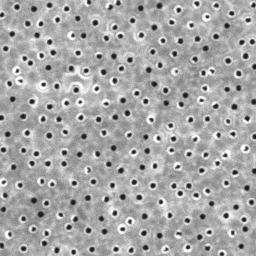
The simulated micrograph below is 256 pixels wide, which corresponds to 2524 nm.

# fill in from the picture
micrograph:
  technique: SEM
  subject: a regular array of holes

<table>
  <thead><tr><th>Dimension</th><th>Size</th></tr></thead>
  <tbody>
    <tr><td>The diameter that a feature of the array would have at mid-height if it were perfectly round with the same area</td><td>0.0567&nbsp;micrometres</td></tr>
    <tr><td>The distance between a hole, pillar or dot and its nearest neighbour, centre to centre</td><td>137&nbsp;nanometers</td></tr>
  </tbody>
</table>